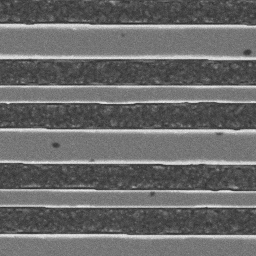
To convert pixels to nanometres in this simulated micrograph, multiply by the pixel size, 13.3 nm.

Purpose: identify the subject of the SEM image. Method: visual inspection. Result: lines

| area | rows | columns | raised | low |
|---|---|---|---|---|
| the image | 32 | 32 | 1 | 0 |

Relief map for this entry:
00000000000000000000000000000000
00000000000000000000000000000000
00000000000000000000000000000000
11111111111111111111111111111111
11111111111111111111111111111111
11111111111111111111111111111111
11111111111111111111111111111111
00000000000000000000000000000000
00000000000000000000000000000000
00000000000000000000000000000000
00000000000000000000000000000000
11111111111111111111111111111111
11111111111111111111111111111111
00000000000000000000000000000000
00000000000000000000000000000000
00000000000000000000000000000000
11111111111111111111111111111111
11111111111111111111111111111111
11111111111111111111111111111111
11111111111111111111111111111111
00000000000000000000000000000010
00000000000000000000000000000000
00000000000000000000000000000000
00000000000000000000000000000000
11111111111111111111111111111111
11111111111111111111111111111111
00000000000000000000000000000000
00000000000000000000000000000000
00000000000000000000000000000000
11111111111111111111111111111111
11111111111111111111111111111111
11111111111111111111111111111111